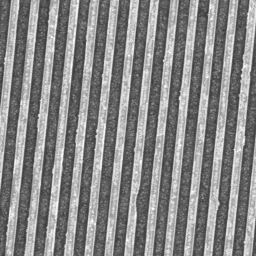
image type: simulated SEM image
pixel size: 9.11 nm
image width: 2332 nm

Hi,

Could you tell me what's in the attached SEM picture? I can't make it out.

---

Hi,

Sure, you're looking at parallel lines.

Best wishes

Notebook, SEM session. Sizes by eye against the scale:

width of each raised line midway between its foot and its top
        69.1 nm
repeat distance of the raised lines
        180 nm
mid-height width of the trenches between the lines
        111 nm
